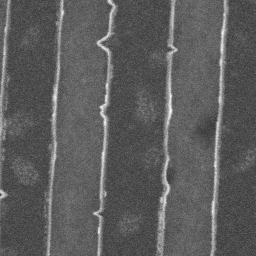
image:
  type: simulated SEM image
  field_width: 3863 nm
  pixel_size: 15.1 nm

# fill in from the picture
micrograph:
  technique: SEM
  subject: one or a few lines or trenches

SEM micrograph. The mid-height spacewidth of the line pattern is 740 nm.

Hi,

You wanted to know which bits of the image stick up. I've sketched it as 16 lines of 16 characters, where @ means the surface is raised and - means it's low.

@@@@---@@@@---@@
@@@@---@@@@---@@
@@@@--@@@@@---@@
@@@@---@@@@---@@
@@@@---@@@@---@@
@@@@---@@@@---@@
@@@@---@@@@---@@
@@@---@@@@@---@@
@@@----@@@----@@
@@@---@@@@----@@
@@@---@@@@---@@@
@@@---@@@@---@@@
@@@---@@@@---@@@
@@@---@@@@---@@@
@@@---@@@@---@@@
@@@---@@@@---@@@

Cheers